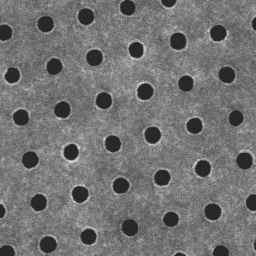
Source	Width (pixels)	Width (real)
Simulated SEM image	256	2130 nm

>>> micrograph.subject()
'a regular array of holes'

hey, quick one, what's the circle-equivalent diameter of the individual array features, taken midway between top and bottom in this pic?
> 16 pixels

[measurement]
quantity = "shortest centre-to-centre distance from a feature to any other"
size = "347 nanometres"